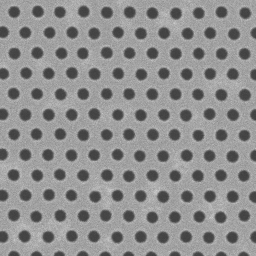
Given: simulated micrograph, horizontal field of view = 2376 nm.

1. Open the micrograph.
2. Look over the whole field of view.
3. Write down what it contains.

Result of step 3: a regular array of holes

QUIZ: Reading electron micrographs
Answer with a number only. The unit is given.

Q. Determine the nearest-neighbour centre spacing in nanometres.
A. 207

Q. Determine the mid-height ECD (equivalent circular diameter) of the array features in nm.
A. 112